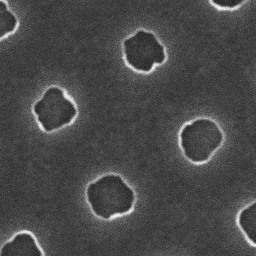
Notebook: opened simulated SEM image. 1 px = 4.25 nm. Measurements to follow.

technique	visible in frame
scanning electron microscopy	holes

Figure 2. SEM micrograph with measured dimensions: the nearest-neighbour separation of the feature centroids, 444 nm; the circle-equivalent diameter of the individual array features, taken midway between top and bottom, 170 nanometres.